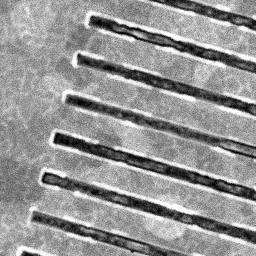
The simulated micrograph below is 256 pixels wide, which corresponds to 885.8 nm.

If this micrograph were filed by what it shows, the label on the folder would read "parallel lines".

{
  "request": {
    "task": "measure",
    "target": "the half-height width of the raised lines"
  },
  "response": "101 nanometers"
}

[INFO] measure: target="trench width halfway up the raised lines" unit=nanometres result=41.6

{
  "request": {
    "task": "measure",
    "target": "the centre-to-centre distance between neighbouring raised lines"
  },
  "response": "141 nanometers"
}